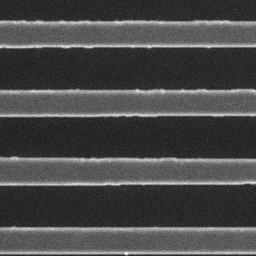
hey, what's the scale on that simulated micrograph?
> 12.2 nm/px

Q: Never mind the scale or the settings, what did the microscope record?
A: lines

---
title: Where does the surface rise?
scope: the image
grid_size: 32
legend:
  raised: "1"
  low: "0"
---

00000000000000000000000000000000
00000000000000000000000000000000
00000000000000000000000000000000
11111111111111111111111111111111
11111111111111111111111111111111
11111111111111111111111111111111
00000000000000000000000000000000
00000000000000000000000000000000
00000000000000000000000000000000
00000000000000000000000000000000
00000000000000000000000000000000
11111111111111111111111111111111
11111111111111111111111111111111
11111111111111111111111111111111
11111111111111111111000000000000
00000000000000000000000000000000
00000000000000000000000000000000
00000000000000000000000000000000
00000000000000000000000000000000
00000000000000000000000000000000
11111111111111111111111111111111
11111111111111111111111111111111
11111111111111111111111111111111
00000000000000000000000000000000
00000000000000000000000000000000
00000000000000000000000000000000
00000000000000000000000000000000
00000000000000000000000000000000
11111111110011001111111111111111
11111111111111111111111111111111
11111111111111111111111111111111
11111111111111111111111111111111